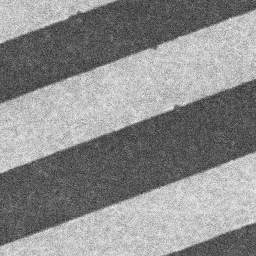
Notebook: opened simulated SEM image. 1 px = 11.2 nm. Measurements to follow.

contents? one or a few lines or trenches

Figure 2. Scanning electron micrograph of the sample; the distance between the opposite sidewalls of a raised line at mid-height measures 715 nanometers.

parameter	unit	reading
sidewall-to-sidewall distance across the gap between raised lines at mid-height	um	0.777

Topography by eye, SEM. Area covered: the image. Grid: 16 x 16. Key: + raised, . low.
++++++..........
+++...........++
...........+++++
........++++++++
.....+++++++++++
...+++++++++++..
++++++++++++....
+++++++++.......
++++++..........
+++.............
+............+++
...........+++++
........++++++++
.....+++++++++++
...+++++++++++..
+++++++++++.....